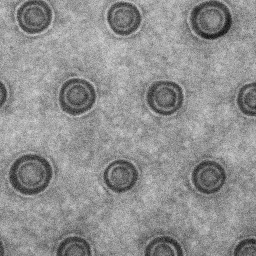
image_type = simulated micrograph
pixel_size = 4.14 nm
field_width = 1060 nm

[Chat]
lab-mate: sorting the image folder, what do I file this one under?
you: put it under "ring-shaped raised bodies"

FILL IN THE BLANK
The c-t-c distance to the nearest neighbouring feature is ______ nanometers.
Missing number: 363